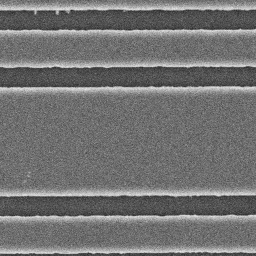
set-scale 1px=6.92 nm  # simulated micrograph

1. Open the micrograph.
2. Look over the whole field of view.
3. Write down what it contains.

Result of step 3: lines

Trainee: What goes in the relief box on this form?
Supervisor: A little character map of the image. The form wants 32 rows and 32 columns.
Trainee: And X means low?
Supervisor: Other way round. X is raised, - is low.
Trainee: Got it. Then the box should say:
XXXXXXXXXXXXXXXXXXXXXXXXXXXXXXXX
--------------------------------
--------------------------------
--------------------------------
XXXXXXXXXXXXXXXXXXXXXXXXXXXXXXXX
XXXXXXXXXXXXXXXXXXXXXXXXXXXXXXXX
XXXXXXXXXXXXXXXXXXXXXXXXXXXXXXXX
XXXXXXXXXXXXXXXXXXXXXXXXXXXXXXXX
--------------------------------
--------------------------------
--------------------------------
XXXXXXXXXXXXXXXXXXXXXXXXXXXXXXXX
XXXXXXXXXXXXXXXXXXXXXXXXXXXXXXXX
XXXXXXXXXXXXXXXXXXXXXXXXXXXXXXXX
XXXXXXXXXXXXXXXXXXXXXXXXXXXXXXXX
XXXXXXXXXXXXXXXXXXXXXXXXXXXXXXXX
XXXXXXXXXXXXXXXXXXXXXXXXXXXXXXXX
XXXXXXXXXXXXXXXXXXXXXXXXXXXXXXXX
XXXXXXXXXXXXXXXXXXXXXXXXXXXXXXXX
XXXXXXXXXXXXXXXXXXXXXXXXXXXXXXXX
XXXXXXXXXXXXXXXXXXXXXXXXXXXXXXXX
XXXXXXXXXXXXXXXXXXXXXXXXXXXXXXXX
XXXXXXXXXXXXXXXXXXXXXXXXXXXXXXXX
XXXXXXXXXXXXXXXXXXXXXXXXXXXXXXXX
--------------------------------
--------------------------------
--------------------------------
XXXXXXXXXXXXXXXXXXXXXXXXXXXXXXXX
XXXXXXXXXXXXXXXXXXXXXXXXXXXXXXXX
XXXXXXXXXXXXXXXXXXXXXXXXXXXXXXXX
XXXXXXXXXXXXXXXXXXXXXXXXXXXXXXXX
XXXXXXXXXXXXXXXXXXXXXXXXXXXXXXXX